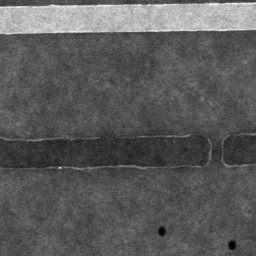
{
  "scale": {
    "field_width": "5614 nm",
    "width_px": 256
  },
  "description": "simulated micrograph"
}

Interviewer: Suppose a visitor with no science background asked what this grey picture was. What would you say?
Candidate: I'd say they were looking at one or a few lines or trenches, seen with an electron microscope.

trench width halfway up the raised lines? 2320 nm